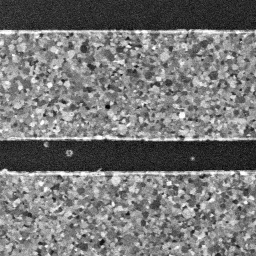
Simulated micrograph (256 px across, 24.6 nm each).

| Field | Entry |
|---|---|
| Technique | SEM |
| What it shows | one or a few lines or trenches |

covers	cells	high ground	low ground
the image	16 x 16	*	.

................
................
****************
****************
****************
****************
****************
****************
****************
................
................
****************
****************
****************
****************
****************